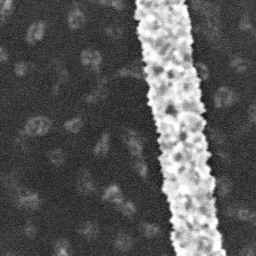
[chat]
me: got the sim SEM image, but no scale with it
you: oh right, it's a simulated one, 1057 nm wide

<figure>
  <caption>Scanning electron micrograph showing one or a few lines or trenches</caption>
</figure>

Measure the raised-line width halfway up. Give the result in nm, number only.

186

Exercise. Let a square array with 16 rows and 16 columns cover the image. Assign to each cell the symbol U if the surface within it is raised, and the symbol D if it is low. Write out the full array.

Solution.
DDDDDDDDDUUUDDDD
DDDDDDDDDUUUDDDD
DDDDDDDDDUUUDDDD
DDDDDDDDDUUUDDDD
DDDDDDDDDUUUDDDD
DDDDDDDDDUUUDDDD
DDDDDDDDDUUUUDDD
DDDDDDDDDDUUUDDD
DDDDDDDDDDUUUDDD
DDDDDDDDDDUUUDDD
DDDDDDDDDDUUUDDD
DDDDDDDDDDUUUDDD
DDDDDDDDDDDUUDDD
DDDDDDDDDDDUUDDD
DDDDDDDDDDDUUUDD
DDDDDDDDDDDUUUDD